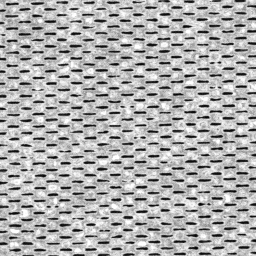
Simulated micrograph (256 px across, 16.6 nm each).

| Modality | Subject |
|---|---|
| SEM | a regular array of holes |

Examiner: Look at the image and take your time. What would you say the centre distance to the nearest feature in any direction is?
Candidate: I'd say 0.199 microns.